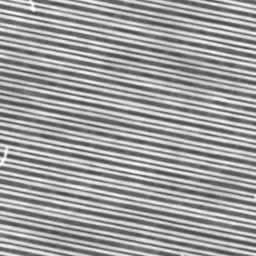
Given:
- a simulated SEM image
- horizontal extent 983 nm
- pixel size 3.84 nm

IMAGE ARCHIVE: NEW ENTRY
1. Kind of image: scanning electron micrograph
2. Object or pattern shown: parallel lines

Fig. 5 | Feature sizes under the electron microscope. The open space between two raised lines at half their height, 0.0165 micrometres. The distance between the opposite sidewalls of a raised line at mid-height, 12.7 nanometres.